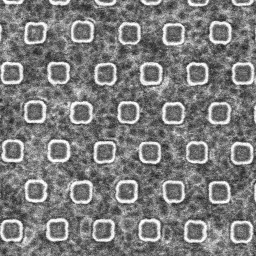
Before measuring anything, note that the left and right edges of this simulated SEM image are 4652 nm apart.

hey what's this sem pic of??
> a regular array of raised bodies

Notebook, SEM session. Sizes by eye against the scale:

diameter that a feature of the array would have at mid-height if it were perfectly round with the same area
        389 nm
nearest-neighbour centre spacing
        0.818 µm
